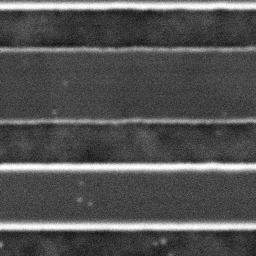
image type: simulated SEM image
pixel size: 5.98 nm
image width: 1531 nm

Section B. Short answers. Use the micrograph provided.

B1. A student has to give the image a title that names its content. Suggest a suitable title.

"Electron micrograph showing lines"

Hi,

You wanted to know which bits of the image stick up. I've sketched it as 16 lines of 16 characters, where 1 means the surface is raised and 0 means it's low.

0000000000000000
0000000000000000
0000000000000000
1111111111111111
1111111111111111
1111111111111111
1111111111111111
1111111111111111
0000000000000000
0000000000000000
1111111111111111
1111111111111111
1111111111111111
1111111111111111
0000000000000000
0000000000000000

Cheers